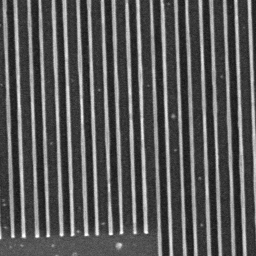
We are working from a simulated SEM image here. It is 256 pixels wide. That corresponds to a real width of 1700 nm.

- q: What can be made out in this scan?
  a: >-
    parallel lines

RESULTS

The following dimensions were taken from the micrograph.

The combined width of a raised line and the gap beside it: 80.9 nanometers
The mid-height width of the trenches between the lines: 8.87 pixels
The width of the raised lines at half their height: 0.0191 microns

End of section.